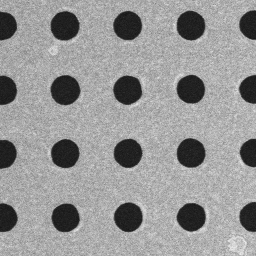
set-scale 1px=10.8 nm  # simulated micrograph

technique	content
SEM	a regular array of holes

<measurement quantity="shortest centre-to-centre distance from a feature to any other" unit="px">62.8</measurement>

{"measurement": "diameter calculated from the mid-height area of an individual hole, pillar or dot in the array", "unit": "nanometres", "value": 313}